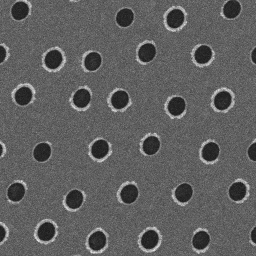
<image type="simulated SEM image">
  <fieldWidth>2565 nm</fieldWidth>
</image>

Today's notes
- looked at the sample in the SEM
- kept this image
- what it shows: a regular array of holes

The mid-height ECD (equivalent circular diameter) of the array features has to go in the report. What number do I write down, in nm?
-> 187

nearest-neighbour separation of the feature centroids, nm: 470